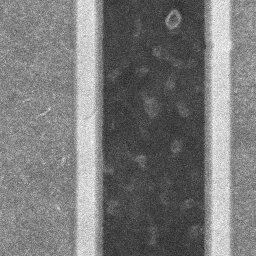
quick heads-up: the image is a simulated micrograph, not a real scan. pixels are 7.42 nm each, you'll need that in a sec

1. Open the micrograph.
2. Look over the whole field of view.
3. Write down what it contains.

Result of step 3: one or a few lines or trenches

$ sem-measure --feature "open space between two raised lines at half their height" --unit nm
993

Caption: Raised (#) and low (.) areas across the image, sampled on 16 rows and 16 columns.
#####.........##
#####.........##
#####.........##
#####.........##
#####.........##
#####.........##
#####.........##
#####.........##
#####.........##
#####.........##
#####.........##
#####.........##
#####.........##
#####.........##
#####.........##
#####.........##